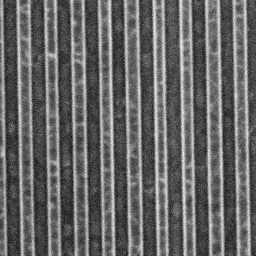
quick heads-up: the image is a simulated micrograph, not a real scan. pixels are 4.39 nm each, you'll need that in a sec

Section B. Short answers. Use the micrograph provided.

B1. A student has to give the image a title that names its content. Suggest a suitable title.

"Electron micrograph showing parallel lines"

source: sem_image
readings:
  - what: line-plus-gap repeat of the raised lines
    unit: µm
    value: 0.118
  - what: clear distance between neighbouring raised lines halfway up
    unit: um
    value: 0.068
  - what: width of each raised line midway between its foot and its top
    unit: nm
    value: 49.3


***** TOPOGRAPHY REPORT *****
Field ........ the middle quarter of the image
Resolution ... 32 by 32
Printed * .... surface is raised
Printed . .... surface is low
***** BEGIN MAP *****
..***....***....***....**....***
..***....***....***....**.....**
..***....***....***....**.....**
..***....***....***....**.....**
..***....***....***....**.....**
..***....***....***....**.....**
..***....***....***....**.....**
..***....***....***....**.....**
..***....***....***....**.....**
..***....***....***....**.....**
..***....***....***....**.....**
..***....***....***....**.....**
..***....***....***....**.....**
..***....***....***....**.....**
..***....***....***....**.....**
..***....***....***....**.....**
...**....***....***....**.....**
...**....***....***....**.....**
...**....***....***....**.....**
...**....***....***....**.....**
...**....***....***....**.....**
...**.....**....***....**.....**
...**.....**....***....***....**
...**.....**....***....***....**
...**.....**....***....***....**
...**.....**....***....**.....**
...**.....**....***....***....**
...**.....**....***....***....**
...***....**....***....***....**
...***....**....***....***....**
...***....**....***....**.....**
...***....**....***....**.....**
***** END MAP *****